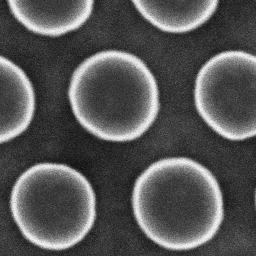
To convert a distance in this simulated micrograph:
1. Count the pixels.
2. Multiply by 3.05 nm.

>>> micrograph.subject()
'raised bodies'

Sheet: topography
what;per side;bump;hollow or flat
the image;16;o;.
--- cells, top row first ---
.ooooo...oooo...
..ooo.....oo....
................
......oo......oo
o....oooo....ooo
oo...ooooo..oooo
oo...ooooo..oooo
oo...oooo....ooo
o.....oo......oo
................
..oo.....oooo...
.oooo....oooo...
.ooooo..oooooo..
.ooooo...ooooo..
..ooo....oooo...
................